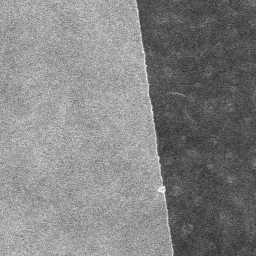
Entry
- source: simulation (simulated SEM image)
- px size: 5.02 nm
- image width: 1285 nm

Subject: one or a few lines or trenches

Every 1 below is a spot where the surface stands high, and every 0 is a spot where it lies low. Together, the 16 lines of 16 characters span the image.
1111111110000000
1111111110000000
1111111110000000
1111111110000000
1111111110000000
1111111110000000
1111111110000000
1111111111000000
1111111111000000
1111111111000000
1111111111000000
1111111111000000
1111111111000000
1111111111000000
1111111111100000
1111111111100000